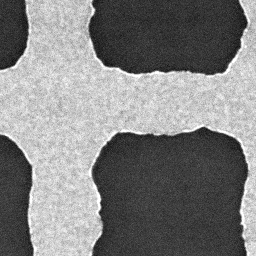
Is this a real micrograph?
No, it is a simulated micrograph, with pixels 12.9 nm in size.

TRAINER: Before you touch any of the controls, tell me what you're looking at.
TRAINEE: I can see holes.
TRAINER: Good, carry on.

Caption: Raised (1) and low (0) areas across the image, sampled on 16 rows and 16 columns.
0011110000000001
0011110000000001
0011110000000001
0111110000000001
1111111100010011
1111111111111111
1111111111111111
1111111111111111
1111111000000011
0111110000000001
0011110000000001
0011110000000001
0011110000000001
0011110000000001
0011110000000001
0011110000000001